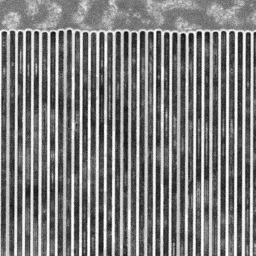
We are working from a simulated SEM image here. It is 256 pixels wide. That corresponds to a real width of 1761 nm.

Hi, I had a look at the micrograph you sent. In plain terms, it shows parallel lines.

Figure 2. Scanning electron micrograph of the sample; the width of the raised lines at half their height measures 0.0138 µm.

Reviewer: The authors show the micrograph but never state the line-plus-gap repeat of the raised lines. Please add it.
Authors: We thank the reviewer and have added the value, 8.12 pixels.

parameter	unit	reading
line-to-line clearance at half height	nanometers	40.4